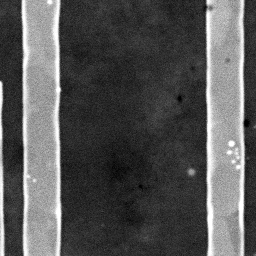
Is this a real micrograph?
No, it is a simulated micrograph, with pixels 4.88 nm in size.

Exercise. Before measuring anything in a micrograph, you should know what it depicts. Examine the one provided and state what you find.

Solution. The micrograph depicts wiring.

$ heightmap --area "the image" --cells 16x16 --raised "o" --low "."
.ooo.........oo.
.ooo.........oo.
.ooo.........oo.
..oo.........oo.
.ooo.........oo.
.ooo.........oo.
..oo.........oo.
..oo.........oo.
..oo.........oo.
..oo.........oo.
..oo.........oo.
..oo.........oo.
..oo.........oo.
..oo.........o..
..oo.........oo.
..oo.........oo.